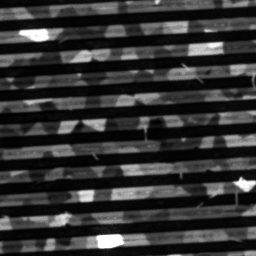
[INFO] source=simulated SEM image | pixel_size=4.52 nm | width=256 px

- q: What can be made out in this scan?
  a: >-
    parallel lines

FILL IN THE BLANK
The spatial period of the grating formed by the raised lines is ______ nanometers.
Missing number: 105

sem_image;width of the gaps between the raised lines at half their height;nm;60.9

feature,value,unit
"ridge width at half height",43.4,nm